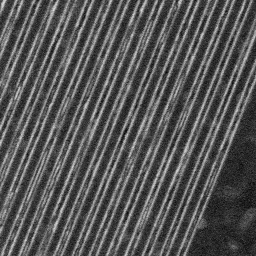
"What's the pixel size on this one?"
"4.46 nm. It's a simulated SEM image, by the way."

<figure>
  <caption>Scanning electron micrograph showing parallel lines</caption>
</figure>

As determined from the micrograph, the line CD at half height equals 54.9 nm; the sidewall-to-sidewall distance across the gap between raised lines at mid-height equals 0.0176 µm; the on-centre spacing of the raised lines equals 73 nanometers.